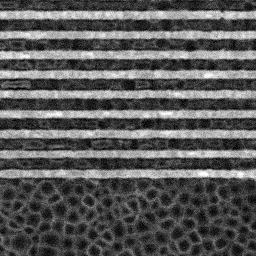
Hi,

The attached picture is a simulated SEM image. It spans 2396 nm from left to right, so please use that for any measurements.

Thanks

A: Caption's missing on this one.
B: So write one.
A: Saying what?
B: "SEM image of parallel lines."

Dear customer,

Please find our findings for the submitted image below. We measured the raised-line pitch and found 186 nanometres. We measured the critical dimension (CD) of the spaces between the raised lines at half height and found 12.7 pixels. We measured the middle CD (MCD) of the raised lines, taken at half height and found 7.62 pixels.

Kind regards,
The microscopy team